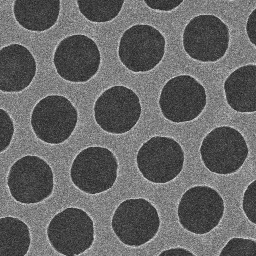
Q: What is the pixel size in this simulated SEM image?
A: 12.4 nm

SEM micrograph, a regular array of holes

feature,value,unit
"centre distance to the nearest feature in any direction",800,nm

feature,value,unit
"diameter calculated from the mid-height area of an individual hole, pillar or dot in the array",584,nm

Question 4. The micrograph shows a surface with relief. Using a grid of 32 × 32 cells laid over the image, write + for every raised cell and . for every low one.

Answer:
++.....+++.....+++....++++++++++
++.....+++.....+++++++++++++++++
++.....++++...++++++++++....+++.
+++...++++++++++...++++.....+++.
+++++++++..++++.....+++......++.
+++++++.....+++......++......+++
....+++.....+++......++.....++++
....+++.....+++.....+++++..+++++
....+++.....++++...+++++++++++..
....++++....++++++++++..+++++...
....+++++++++++++++++....+++....
+++++++++++++....+++......++....
+++++....+++.....+++......++....
++++.....+++......++......+++...
.+++......++......+++....+++++++
..++......++.....+++++++++++++++
..++.....++++...++++++++++....++
.++++...+++++++++++...+++......+
.++++++++++..+++++.....++......+
+++.++++++....+++......++......+
++....+++......++......+++....++
+......++......+++....+++++..+++
+......++.....+++++..+++++++++++
+......+++....++++++++++..+++++.
++....+++++++++++++++++.....++..
+++++++++++++++....+++......++..
++++++++...+++......++......+++.
...+++.....+++......++.....++++.
...+++......++......+++....+++++
....++......+++....+++++++++++++
....++.....+++++..++++++++++....
...++++...++++++++++....++++....